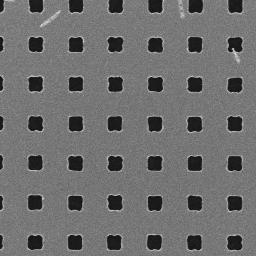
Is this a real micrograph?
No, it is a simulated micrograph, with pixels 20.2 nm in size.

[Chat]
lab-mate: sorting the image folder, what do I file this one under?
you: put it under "a regular array of holes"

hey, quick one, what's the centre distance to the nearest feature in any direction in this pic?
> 796 nm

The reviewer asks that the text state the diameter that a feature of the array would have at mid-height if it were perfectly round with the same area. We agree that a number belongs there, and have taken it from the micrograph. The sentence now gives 325 nanometres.